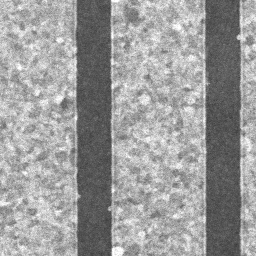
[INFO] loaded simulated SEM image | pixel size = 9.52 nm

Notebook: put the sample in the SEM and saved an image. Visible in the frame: one or a few lines or trenches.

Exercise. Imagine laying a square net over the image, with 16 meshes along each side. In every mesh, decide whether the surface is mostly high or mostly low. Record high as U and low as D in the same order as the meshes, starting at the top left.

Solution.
UUUUUDDUUUUUUDDU
UUUUUDDUUUUUUDDU
UUUUUDDUUUUUUDDU
UUUUUDDUUUUUUDDU
UUUUUDDUUUUUUDDU
UUUUUDDUUUUUUDDU
UUUUUDDUUUUUUDDU
UUUUUDDUUUUUUDDU
UUUUUDDUUUUUUDDU
UUUUUDDUUUUUUDDU
UUUUUDDUUUUUUDDU
UUUUUDDUUUUUUDDU
UUUUUDDUUUUUUDDU
UUUUUDDUUUUUUDDU
UUUUUDDUUUUUUDDU
UUUUUDDUUUUUUDDU